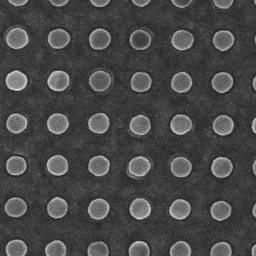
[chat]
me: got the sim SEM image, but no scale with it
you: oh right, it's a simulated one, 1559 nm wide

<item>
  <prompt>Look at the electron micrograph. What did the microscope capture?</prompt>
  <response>a regular array of raised bodies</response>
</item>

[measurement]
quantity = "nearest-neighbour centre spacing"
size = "249 nm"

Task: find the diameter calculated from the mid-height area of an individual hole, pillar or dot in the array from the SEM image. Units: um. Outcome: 0.124